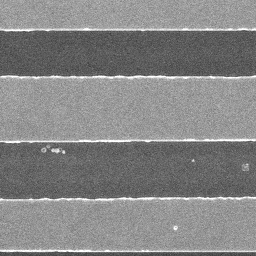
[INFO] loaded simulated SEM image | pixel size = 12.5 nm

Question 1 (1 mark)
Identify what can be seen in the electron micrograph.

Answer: lines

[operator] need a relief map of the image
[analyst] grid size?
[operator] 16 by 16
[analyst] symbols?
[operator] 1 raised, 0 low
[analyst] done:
1111111111111111
1111111111111111
0000000000000000
0000000000000000
0000000000000000
1111111111111111
1111111111111111
1111111111111111
1111111111111111
0000000000000000
0000000000000000
0000000000000000
1111111111111111
1111111111111111
1111111111111111
1111111111111111